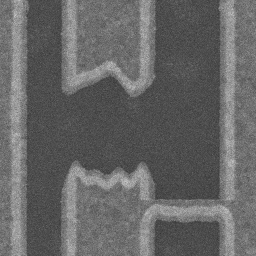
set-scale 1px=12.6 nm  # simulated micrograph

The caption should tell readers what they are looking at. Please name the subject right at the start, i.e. one or a few lines or trenches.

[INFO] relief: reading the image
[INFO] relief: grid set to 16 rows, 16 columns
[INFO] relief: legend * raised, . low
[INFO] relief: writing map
*...*****.....**
*...*****.....**
*...*****.....**
*...*****.....**
*...**.**.....**
*.............**
*.............**
*.............**
*.............**
*.............**
*.............**
*...*****.....**
*...*******.*.**
*...*****.....**
*...*****.....**
*...*****.....**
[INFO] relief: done